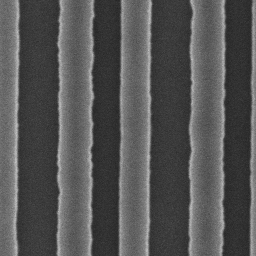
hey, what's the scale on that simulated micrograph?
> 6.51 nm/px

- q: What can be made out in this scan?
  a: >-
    lines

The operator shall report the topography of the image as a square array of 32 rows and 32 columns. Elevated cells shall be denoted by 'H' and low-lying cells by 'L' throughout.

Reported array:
HHLLLLLLHHHHLLLHHHHLLLLLHHHHLLLL
HHLLLLLLHHHHLLLHHHHLLLLLHHHHLLLL
HHLLLLLHHHHHLLLHHHHLLLLLHHHHLLLL
HHLLLLLHHHHHLLLHHHHLLLLLHHHHLLLL
HHLLLLLHHHHHLLLHHHHLLLLLHHHHLLLL
HHLLLLLHHHHHLLLHHHHLLLLLHHHHLLLL
HHLLLLLHHHHHLLLHHHHLLLLLHHHHLLLL
HHLLLLLHHHHHLLLHHHHLLLLLHHHHLLLL
HHLLLLLHHHHHLLLHHHHLLLLLHHHHLLLL
HHLLLLLHHHHHLLLHHHHLLLLLHHHHLLLH
HHLLLLLHHHHHLLLHHHHLLLLLHHHHLLLH
HHLLLLLHHHHHLLLHHHHLLLLLHHHHLLLH
HHLLLLLHHHHHLLLHHHHLLLLLHHHHLLLL
HHLLLLLHHHHHLLLHHHHLLLLLHHHHLLLL
HHLLLLLHHHHLLLLHHHHLLLLLHHHHLLLH
HHLLLLLHHHHHLLLHHHHLLLLLHHHHLLLH
HHLLLLLHHHHHLLLHHHHLLLLLHHHHLLLH
HHLLLLLHHHHHLLLHHHHLLLLLHHHHLLLH
HHLLLLLHHHHLLLLHHHHLLLLLHHHHLLLH
HHLLLLLHHHHLLLLHHHHLLLLLHHHHLLLH
HHLLLLLHHHHHLLLHHHHLLLLLHHHHLLLH
HHLLLLLHHHHLLLLHHHHLLLLLHHHHLLLH
HHLLLLLHHHHHLLLHHHHLLLLLHHHHLLLH
HHLLLLLHHHHHLLLHHHHLLLLLHHHHLLLH
HHLLLLLHHHHLLLLHHHHLLLLLHHHHLLLH
HHLLLLLHHHHLLLLHHHHLLLLLHHHHLLLH
HHLLLLLHHHHLLLLHHHHLLLLLHHHHLLLH
HHLLLLLHHHHLLLLHHHHLLLLLHHHHLLLH
HHLLLLLHHHHLLLLHHHHLLLLLHHHHLLLH
HHLLLLLHHHHHLLLHHHLLLLLLHHHHLLLH
HHLLLLLHHHHLLLLHHHLLLLLLHHHHLLLH
HHLLLLLHHHHLLLLHHHLLLLLLHHHHLLLH